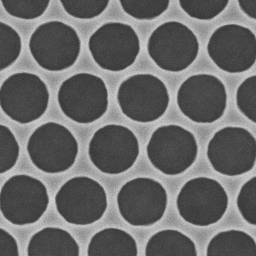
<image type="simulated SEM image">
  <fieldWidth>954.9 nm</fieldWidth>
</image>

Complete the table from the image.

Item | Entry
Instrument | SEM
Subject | a regular array of holes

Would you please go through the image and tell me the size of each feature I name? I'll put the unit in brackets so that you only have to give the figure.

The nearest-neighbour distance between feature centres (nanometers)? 220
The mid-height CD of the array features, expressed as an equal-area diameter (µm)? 0.184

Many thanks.